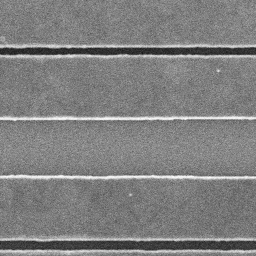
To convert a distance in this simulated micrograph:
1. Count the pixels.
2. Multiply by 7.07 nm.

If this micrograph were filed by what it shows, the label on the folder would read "lines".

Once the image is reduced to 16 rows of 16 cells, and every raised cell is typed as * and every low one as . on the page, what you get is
****************
****************
****************
****************
****************
****************
****************
................
................
................
................
****************
****************
****************
****************
................